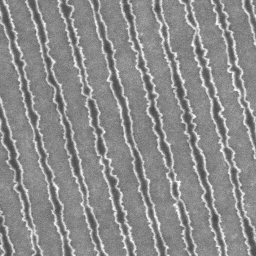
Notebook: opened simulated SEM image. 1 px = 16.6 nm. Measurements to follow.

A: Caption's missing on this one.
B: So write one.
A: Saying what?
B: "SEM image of parallel lines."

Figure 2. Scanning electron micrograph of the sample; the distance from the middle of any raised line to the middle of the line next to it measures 493 nm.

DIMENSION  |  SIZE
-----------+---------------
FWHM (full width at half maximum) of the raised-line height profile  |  148 nm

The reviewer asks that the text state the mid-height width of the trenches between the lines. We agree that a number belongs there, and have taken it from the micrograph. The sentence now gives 343 nm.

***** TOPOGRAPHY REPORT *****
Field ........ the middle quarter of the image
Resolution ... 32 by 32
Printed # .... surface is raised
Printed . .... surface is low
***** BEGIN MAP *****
...##......##.....###.....###...
....#......##......##......##...
....##.....##......##......##...
....##.....###.....###.....##...
....##.....###......##.....###..
.....#......###.....###....###..
....###.....###.....###.....##..
.....##.....###......##.....###.
......#......###.....##.....##..
......##.....###.....##......##.
......##......##.....##......##.
......###.....##.....###......##
......###.....##.....###......##
#.....###.....###.....##.....###
#......##......##.....###.....##
##.....##......##.....##......##
##......##.....##.....###.....##
##......##.....##......##......#
##......##.....##......##......#
###.....##......##.....###.....#
###.....##......##.....###......
.##.....###......#......###.....
.###....###......##......##.....
.###.....##......###.....##.....
..##.....###.....###.....##.....
..##......##.....###.....##.....
..##......##.....###......#.....
..###.....##......##......##....
...##.....###.....##......##....
...##......###.....##......##...
....##.....##......##......##...
....##.....###.....##......##...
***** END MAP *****